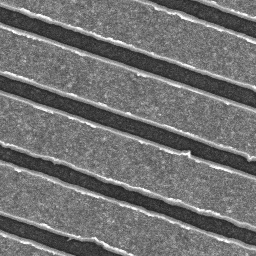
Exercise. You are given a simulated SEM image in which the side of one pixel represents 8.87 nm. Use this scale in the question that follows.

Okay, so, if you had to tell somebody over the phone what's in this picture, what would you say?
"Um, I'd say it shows one or a few lines or trenches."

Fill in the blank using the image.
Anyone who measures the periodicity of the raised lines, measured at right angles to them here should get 583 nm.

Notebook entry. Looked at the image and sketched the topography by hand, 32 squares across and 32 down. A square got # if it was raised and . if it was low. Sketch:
###################.......######
...###################.......###
......###################.......
#........###################....
#####.......##################..
#######........#################
##########........##############
#############........###########
################........########
.##################........#####
....##################........##
.......##################.......
###.......##################....
######.......##################.
#########.......################
############.......#############
###############.......##########
##################.......#######
..###################.......####
.....###################.......#
#.......###################.....
####.......###################..
#######......###################
##########......################
#############......#############
################.......#########
###################......#######
...##################........###
......##################........
##.......##################.....
####.........#################..
#######........#################